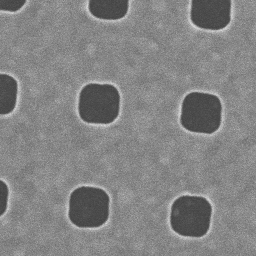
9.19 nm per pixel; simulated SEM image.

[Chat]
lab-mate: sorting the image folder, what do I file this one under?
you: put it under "holes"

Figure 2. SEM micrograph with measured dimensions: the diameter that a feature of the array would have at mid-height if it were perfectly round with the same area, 0.396 micrometres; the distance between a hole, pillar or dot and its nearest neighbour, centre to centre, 943 nm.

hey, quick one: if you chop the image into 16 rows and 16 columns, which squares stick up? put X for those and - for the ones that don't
-XXXXX--XXXX--XX
XXXXXXXXXXXX--XX
XXXXXXXXXXXXXXXX
XXXXXXXXXXXXXXXX
XXXXXXXXXXXXXXXX
-XXXX--XXXXXXXXX
-XXXX--XXXX---XX
XXXXX--XXXX---XX
XXXXXXXXXXXXXXXX
XXXXXXXXXXXXXXXX
XXXXXXXXXXXXXXXX
XXXXXXXXXXXXXXXX
XXXX---XXXX--XXX
XXXX---XXXX--XXX
XXXXXXXXXXX--XXX
XXXXXXXXXXXXXXXX